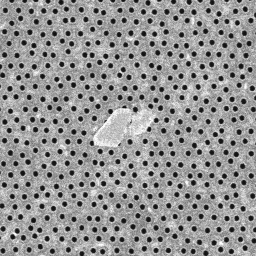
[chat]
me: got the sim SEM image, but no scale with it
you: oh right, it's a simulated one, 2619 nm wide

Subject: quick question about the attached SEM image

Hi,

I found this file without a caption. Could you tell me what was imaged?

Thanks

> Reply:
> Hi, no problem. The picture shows a regular array of holes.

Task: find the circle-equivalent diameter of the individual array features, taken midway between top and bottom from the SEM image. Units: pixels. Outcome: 5.17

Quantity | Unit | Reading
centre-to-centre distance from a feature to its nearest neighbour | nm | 107